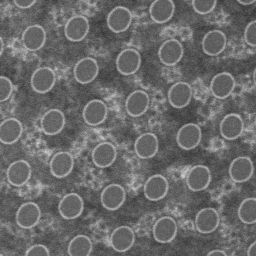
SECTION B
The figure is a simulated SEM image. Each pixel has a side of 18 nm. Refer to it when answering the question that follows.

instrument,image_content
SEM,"a regular array of raised bodies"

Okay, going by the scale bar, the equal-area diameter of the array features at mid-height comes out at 424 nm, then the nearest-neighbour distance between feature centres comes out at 774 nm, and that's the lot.